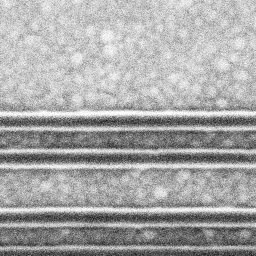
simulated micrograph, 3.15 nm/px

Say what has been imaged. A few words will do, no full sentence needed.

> parallel lines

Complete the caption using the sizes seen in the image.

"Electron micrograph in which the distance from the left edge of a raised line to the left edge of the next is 48 px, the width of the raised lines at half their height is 53.6 nanometers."